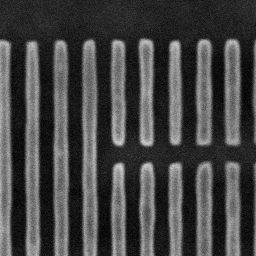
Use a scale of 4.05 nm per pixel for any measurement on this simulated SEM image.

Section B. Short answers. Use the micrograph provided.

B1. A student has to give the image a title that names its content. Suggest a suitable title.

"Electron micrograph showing wiring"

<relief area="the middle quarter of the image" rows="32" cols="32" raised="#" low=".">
.....##.....###....###.....##...
.....##.....###....###.....##...
.....##.....###.....##.....##...
.....##.....###.....##.....##...
.....##.....###.....##.....##...
.....##......##.....##.....##...
.....###.....##.....##.....##...
.....###.....##.....##.....##...
.....###.....##.....##.....##...
.....###.....##.....##.....##...
.....###.....##.....##.....##...
.....###.....##.....##.....##...
.....###.....##....###.....##...
.....###.....##....###.....##...
.....###.....##....###.....##...
.....###.....##....###.....##...
.....##......##....###.....##...
.....##......##....###.....##...
#....##......##....###.....##...
#....##......##.....##.....#....
#....##.........................
#....###........................
#....###........................
#....##.........................
#....##.........................
#....##......#......##.....##...
#....##......#......##.....##...
#....###.....#......##.....##...
#....###.....#......##.....##...
#....###.....##.....##.....##...
#....###.....##.....##.....##...
#....###.....##.....##.....##...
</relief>